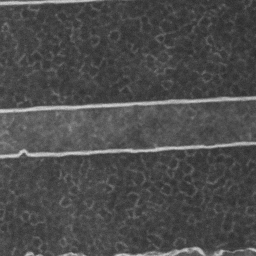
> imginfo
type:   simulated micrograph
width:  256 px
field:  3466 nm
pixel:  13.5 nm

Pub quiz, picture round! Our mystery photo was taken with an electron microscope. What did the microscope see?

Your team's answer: one or a few lines or trenches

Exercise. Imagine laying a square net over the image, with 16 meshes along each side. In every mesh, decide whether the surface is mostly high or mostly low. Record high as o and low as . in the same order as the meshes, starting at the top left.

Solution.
oooooooooooooooo
oooooooooooooooo
oooooooooooooooo
oooooooooooooooo
oooooooooooooooo
oooooooooooooooo
oooooooo........
................
................
......oooooooooo
oooooooooooooooo
oooooooooooooooo
oooooooooooooooo
oooooooooooooooo
oooooooooooooooo
oooooooooooooooo